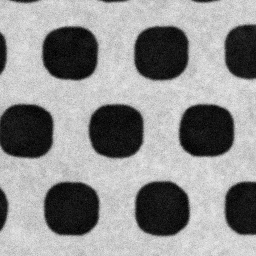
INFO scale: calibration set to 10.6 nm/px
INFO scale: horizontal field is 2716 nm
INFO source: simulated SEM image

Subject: holes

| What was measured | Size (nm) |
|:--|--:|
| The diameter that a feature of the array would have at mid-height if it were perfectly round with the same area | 604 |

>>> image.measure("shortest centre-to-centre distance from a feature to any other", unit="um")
0.954